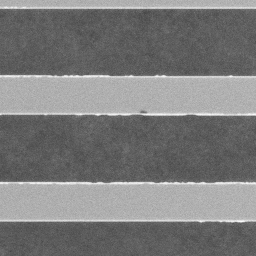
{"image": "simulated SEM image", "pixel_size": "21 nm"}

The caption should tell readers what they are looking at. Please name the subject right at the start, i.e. lines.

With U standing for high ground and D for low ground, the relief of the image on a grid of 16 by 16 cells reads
DDDDDDDDDDDDDDDD
DDDDDDDDDDDDDDDD
DDDDDDDDDDDDDDDD
DDDDDDDDDDDDDDDD
DDDDDDDDDDDDDDDD
UUUUUUUUUUUUUUUU
UUUUUUUUUUUUUUUU
DDDDDDDDDDDDDDDD
DDDDDDDDDDDDDDDD
DDDDDDDDDDDDDDDD
DDDDDDDDDDDDDDDD
UUUUUUUUUUUUUUUU
UUUUUUUUUUUUUUUU
UUUUUUUUUUUUUUUU
DDDDDDDDDDDDDDDD
DDDDDDDDDDDDDDDD